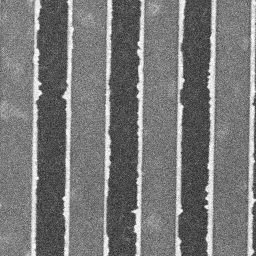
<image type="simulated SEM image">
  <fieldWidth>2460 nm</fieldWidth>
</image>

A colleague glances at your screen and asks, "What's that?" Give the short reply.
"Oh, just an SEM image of one or a few lines or trenches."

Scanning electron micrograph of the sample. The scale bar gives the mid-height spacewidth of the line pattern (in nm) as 351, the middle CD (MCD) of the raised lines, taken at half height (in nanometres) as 342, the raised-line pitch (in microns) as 0.691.